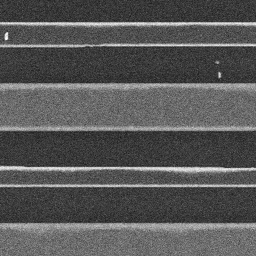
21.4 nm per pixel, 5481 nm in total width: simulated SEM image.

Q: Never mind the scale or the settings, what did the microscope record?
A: lines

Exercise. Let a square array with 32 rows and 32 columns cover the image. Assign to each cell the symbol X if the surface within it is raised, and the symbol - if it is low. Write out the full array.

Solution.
--------------------------------
--------------------------------
--------------------------------
XXXXXXXXXXXXXXXXXXXXXXXXXXXXXXXX
XXXXXXXXXXXXXXXXXXXXXXXXXXXXXXXX
XXXXXXXXXXXXXXXXXXXXXXXXXXXXXXXX
--------------------------------
--------------------------------
--------------------------------
--------------------------------
-------------------XXXXXXX------
XXXXXXXXXXXXXXXXXXXXXXXXXXXXXXXX
XXXXXXXXXXXXXXXXXXXXXXXXXXXXXXXX
XXXXXXXXXXXXXXXXXXXXXXXXXXXXXXXX
XXXXXXXXXXXXXXXXXXXXXXXXXXXXXXXX
XXXXXXXXXXXXXXXXXXXXXXXXXXXXXXXX
--------------------------------
--------------------------------
--------------------------------
--------------------------------
--------------------------------
XXXXXXXXXXXXXXXXXXXXXXXXXXXXXXXX
XXXXXXXXXXXXXXXXXXXXXXXXXXXXXXXX
--------------------------------
--------------------------------
--------------------------------
--------------------------------
--------------------------------
XXXXXXXXXXXXXXXXXXXXXXXXXXXXXXXX
XXXXXXXXXXXXXXXXXXXXXXXXXXXXXXXX
XXXXXXXXXXXXXXXXXXXXXXXXXXXXXXXX
XXXXXXXXXXXXXXXXXXXXXXXXXXXXXXXX